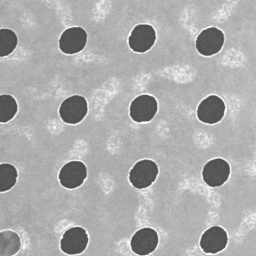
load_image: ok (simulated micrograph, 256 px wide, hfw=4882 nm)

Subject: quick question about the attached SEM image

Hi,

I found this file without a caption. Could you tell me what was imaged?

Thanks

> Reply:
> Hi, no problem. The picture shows a regular array of holes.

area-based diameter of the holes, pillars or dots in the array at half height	540	nm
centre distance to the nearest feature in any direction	1250	nm